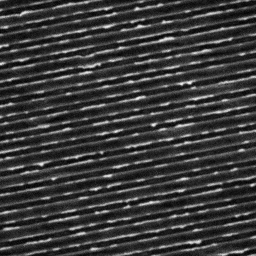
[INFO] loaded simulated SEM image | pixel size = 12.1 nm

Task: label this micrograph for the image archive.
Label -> parallel lines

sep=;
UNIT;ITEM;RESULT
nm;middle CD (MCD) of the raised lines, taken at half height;141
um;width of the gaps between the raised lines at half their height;0.067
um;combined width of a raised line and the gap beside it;0.212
